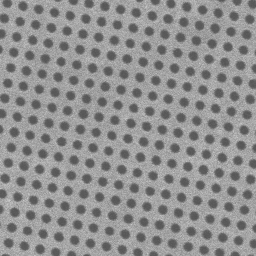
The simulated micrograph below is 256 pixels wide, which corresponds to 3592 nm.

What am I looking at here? a regular array of holes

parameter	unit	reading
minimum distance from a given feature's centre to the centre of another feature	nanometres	219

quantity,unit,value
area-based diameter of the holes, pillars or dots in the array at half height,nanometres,142